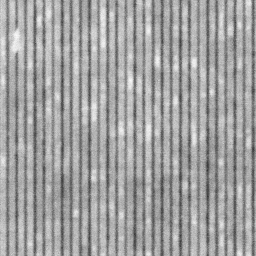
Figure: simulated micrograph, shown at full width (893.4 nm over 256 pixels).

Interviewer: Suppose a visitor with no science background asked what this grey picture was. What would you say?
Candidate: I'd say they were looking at parallel lines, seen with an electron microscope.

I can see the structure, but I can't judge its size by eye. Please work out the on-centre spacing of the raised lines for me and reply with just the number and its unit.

31.8 nm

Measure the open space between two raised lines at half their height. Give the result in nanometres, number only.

13.5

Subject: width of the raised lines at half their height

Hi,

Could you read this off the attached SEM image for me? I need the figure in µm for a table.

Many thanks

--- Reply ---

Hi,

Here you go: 0.0201